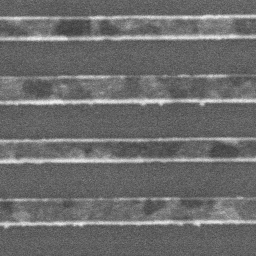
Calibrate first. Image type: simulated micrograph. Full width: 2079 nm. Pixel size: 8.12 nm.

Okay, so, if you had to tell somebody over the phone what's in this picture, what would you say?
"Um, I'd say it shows lines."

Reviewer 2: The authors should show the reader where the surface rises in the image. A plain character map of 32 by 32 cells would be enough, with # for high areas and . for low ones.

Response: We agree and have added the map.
................................
................................
################################
################################
################################
................................
................................
................................
................................
......................##.#######
################################
################################
################################
................................
................................
................................
................................
............####################
################################
################################
................................
................................
................................
................................
................................
################################
################################
################################
................................
................................
................................
................................